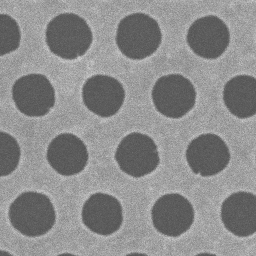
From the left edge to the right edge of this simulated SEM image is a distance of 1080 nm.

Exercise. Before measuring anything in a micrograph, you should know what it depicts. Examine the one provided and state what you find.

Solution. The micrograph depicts a regular array of holes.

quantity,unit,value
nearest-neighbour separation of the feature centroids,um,0.289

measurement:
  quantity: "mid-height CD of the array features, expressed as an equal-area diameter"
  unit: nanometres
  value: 185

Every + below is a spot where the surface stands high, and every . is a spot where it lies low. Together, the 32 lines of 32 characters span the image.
++++++++++++++++++++++++++++++++
++++++++++++++++++++++++++++++++
..++++.....++++....+++++....++++
..++++.....++++.....++++....++++
...+++......++......+++......+++
..++++.....++++.....+++......+++
.+++++.....++++....+++++....++++
++++++++++++++++++++++++++++++++
++++++++++++++++++++++++++++++++
+++...++++++..++++++...++++++...
++....+++++....++++.....++++....
+......+++......+++.....++++....
++.....+++......+++.....++++....
++....+++++....++++.....++++....
+++..+++++++..+++++++..++++++...
++++++++++++++++++++++++++++++++
.+++++++++++++++++++++++++++++++
..+++++...+++++....+++++....++++
...+++.....++++.....+++......+++
...+++.....+++......+++......+++
..++++.....++++.....+++......+++
..+++++...+++++....+++++....++++
++++++++++++++++++++++++++++++++
++++++++++++++++++++++++++++++++
++....+++++...++++++...++++++...
+.....++++.....++++.....++++....
+......+++.....++++.....++++....
+......+++.....++++.....++++....
++....+++++....++++.....++++....
+++..++++++++++++++++.+++++++..+
++++++++++++++++++++++++++++++++
.+++++++++++++++++++++++++++++++